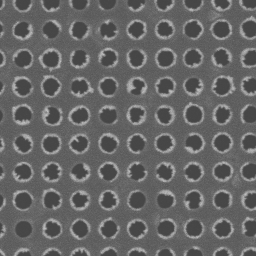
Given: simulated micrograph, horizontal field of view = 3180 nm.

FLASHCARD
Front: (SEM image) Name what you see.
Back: a regular array of holes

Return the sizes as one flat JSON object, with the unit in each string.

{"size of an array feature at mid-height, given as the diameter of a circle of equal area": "0.194 µm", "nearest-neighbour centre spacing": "345 nm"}